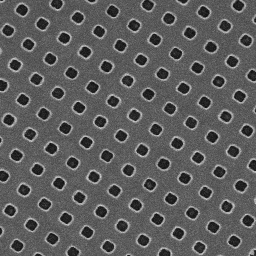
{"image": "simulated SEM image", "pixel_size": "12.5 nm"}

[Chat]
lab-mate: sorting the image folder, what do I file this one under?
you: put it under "a regular array of holes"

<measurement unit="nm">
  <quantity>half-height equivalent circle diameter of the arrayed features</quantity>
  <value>149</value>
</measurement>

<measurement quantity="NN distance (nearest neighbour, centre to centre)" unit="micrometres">0.307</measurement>